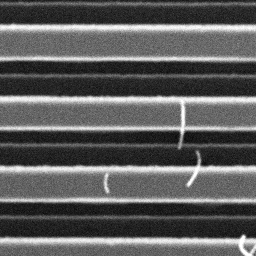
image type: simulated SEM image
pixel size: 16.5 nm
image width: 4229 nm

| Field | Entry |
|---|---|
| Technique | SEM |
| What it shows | lines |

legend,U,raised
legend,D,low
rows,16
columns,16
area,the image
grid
DDDDDDDDDDDDDDDD
DDDDDDDDDDDDDDDD
UUUUUUUUUUUUUUUU
UUUUUUUUUUUUUUUU
DDDDDDDDDDDDDDDD
DDDDDDDDDDDDDDDD
UUUUUUUUUUUUUUUU
UUUUUUUUUUUUUUUU
DDDDDDDDDDDDDDDD
DDDDDDDDDDDDDDDD
UUUUUUUUUUUUUUUU
UUUUUUUUUUUUUUUU
UUUUUUUUUUUUUUUU
DDDDDDDDDDDDDDDD
DDDDDDDDDDDDDDDD
UUUUUUUUUUUUUUUU